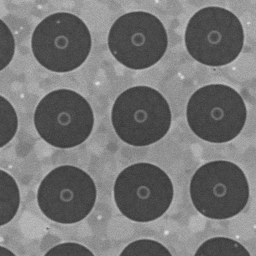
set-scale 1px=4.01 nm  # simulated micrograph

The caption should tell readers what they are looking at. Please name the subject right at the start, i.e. an array of small figures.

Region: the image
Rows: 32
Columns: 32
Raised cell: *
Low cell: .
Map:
********************************
****************..*******....***
*****.....*****.....****......**
.***.......***.......**.......**
..**.......***...*...**...*....*
..**...*...**....*...**.......**
..**.......***.......***......**
.****......****.....****.....***
.*****....******..**************
********************************
********************************
******...******.....****......**
.****......***.......***......**
..***......***.......**........*
..**...**...**...*...**....*...*
..****......**.......***.......*
..***......***.......***......**
.*****.....****.....******...***
*******..***********************
********************************
*****************..*******...***
.*****.....****......***......**
..***.......**.......***.......*
..***.......**........**...*...*
...**...*...**...*....**.......*
..***.......**.......***.......*
..***......****......****.....**
.*****....******...*************
********************************
********************************
*******...******....*****.....**
..****.....****......***.......*